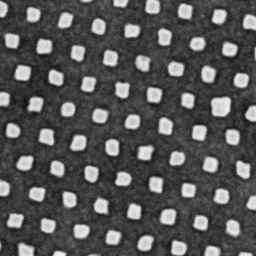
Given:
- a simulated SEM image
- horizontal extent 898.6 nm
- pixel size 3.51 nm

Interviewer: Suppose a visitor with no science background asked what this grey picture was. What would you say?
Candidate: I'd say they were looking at a regular array of raised bodies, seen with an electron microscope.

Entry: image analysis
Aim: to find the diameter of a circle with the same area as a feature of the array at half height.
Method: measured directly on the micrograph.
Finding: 51.7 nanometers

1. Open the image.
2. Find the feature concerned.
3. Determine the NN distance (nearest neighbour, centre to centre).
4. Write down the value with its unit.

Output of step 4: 115 nm